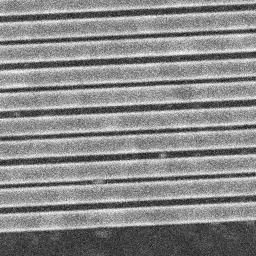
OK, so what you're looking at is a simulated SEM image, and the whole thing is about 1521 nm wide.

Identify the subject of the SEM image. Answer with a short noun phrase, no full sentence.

parallel lines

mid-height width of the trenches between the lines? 7.74 px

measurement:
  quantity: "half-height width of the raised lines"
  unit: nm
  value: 101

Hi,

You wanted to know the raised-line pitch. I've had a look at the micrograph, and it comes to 23.9 pixels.